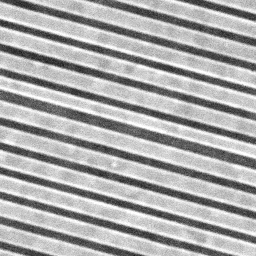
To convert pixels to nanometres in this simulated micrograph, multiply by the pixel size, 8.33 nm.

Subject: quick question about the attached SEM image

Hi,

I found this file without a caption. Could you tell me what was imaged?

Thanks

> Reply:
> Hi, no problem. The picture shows parallel lines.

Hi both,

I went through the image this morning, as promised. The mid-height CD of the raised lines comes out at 123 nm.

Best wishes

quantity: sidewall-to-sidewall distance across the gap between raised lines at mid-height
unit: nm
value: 74.4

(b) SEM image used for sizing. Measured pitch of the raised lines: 23.8 px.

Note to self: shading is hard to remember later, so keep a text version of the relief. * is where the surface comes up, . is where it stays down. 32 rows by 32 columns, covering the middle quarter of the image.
.....**************..........***
.........**************.........
****.........*************......
********........**************..
***********.........************
.**************.........********
.....**************........*****
........**************..........
***.........**************......
*******.........**************..
.**********........*************
....***********........*********
........***********........*****
............**********........**
***............**********.......
*******............**********...
**********.............*********
**************............******
....**************............**
.......**************...........
***........**************.......
******.........**************...
**********........**************
**************........**********
...**************.........******
.......**************........***
**.........**************.......
******........**************....
*********.........**************
*************.........**********
...**************........*******
.......*************.........***